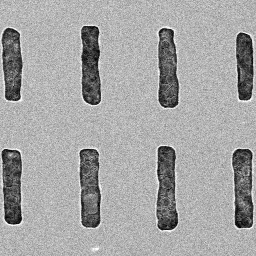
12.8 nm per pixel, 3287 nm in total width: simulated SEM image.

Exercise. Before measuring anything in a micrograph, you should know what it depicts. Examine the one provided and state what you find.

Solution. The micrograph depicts a regular array of holes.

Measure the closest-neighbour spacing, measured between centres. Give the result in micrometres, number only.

0.99